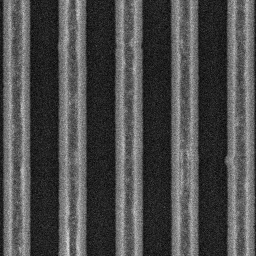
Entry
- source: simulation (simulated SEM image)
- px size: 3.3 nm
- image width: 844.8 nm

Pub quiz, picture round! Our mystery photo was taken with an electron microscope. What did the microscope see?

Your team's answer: parallel lines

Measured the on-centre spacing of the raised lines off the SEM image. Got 185 nm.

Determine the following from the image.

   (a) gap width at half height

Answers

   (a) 124 nm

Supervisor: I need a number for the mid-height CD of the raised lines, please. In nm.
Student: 62.3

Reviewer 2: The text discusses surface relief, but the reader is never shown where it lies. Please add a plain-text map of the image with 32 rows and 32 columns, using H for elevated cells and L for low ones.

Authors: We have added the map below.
LHHLLLLLHHLLLLLHHLLLLLHHLLLLLHHL
LHHLLLLLHHLLLLLHHLLLLLHHLLLLLHHL
LHHLLLLLHHLLLLLHHLLLLLHHLLLLLHHL
LHHLLLLLHHLLLLLHHLLLLLHHLLLLLHHL
LHHLLLLLHHLLLLLHHLLLLLHHLLLLLHHL
LHHLLLLLHHLLLLLHHLLLLLHHLLLLLHHL
LHHLLLLLHHLLLLLHHLLLLLHHLLLLLHHL
LHHLLLLLHHLLLLLHHLLLLLHHLLLLLHHL
LHHLLLLLHHLLLLLHHLLLLLHHLLLLLHHL
LHHLLLLLHHLLLLLHHLLLLLHHLLLLLHHL
LHHLLLLLHHLLLLLHHLLLLLHHLLLLLHHL
LHHLLLLLHHLLLLLHHLLLLLHHLLLLLHHL
LHHLLLLLHHLLLLLHHLLLLLHHLLLLLHHL
LHHLLLLLHHLLLLLHHLLLLLHHLLLLLHHL
LHHLLLLLHHLLLLLHHLLLLLHHLLLLLHHL
LHHLLLLLHHLLLLLHHLLLLLHHLLLLLHHL
LHHLLLLLHHLLLLLHHLLLLLHHLLLLLHHL
LHHLLLLLHHLLLLLHHLLLLLHHLLLLLHHL
LHHLLLLLHHLLLLLHHLLLLLHHLLLLLHHL
LHHLLLLLHHLLLLLHHLLLLLHHLLLLLHHL
LHHLLLLLHHLLLLLHHLLLLLHHLLLLLHHL
LHHLLLLLHHLLLLLHHLLLLLHHLLLLLHHL
LHHLLLLLHHLLLLLHHLLLLLHHLLLLLHHL
LHHLLLLLHHLLLLLHHLLLLLHHLLLLLHHL
LHHLLLLLHHLLLLLHHLLLLLHHLLLLLHHL
LHHLLLLLHHLLLLLHHLLLLLHHLLLLLHHL
LHHLLLLLHHLLLLLHHLLLLLHHLLLLLHHL
LHHLLLLLHHLLLLLHHLLLLLHHLLLLLHHL
LHHLLLLLHHLLLLLHHLLLLLHHLLLLLHHL
LHHLLLLLHHLLLLLHHLLLLLHHLLLLLHHL
LHHLLLLLHHLLLLLHHLLLLLHHLLLLLHHL
LHHLLLLLHHLLLLLHHLLLLLHHLLLLLHHL